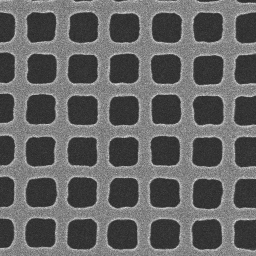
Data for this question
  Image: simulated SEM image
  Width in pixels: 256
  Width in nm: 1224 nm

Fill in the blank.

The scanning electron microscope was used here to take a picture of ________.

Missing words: a regular array of holes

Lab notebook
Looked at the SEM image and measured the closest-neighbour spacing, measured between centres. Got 40.8 pixels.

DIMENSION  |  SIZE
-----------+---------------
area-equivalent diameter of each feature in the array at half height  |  154 nm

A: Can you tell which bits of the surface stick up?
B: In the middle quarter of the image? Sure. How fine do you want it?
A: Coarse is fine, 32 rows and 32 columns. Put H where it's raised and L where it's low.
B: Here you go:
HLLLLLLLLHHLLLLLLLLHHHLLLLLLLHHH
HLLLLLLLLHHLLLLLLLLHHHLLLLLLLHHH
HLLLLLLLLHHLLLLLLLLHHHLLLLLLLHHH
HLLLLLLLHHHLLLLLLLLHHHLLLLLLLHHH
HHLLLLLHHHHHLLLLLLHHHHHLLLLLHHHH
HHHHHHHHHHHHHHHHHHHHHHHHHHHHHHHH
HHHHHHHHHHHHHHHHHHHHHHHHHHHHHHHH
HHHHHHHHHHHHHHHHHHHHHHHHHHHHHHHH
HLLLLLLLHHHHLLLLLLHHHHLLLLLLLHHH
HLLLLLLLLHHLLLLLLLLHHHLLLLLLLHHH
HLLLLLLLLHHLLLLLLLLHHHLLLLLLLHHH
HLLLLLLLLHHLLLLLLLLHHHLLLLLLLHHH
HLLLLLLLLHHLLLLLLLLHHHLLLLLLLHHH
HLLLLLLLLHHLLLLLLLLHHHLLLLLLLHHH
HLLLLLLLHHHHLLLLLLHHHHLLLLLLHHHH
HHHHHHHHHHHHHHHHHHHHHHHHHHHHHHHH
HHHHHHHHHHHHHHHHHHHHHHHHHHHHHHHH
HHHHHHHHHHHHHHHHHHHHHHHHHHHHHHHH
HHLLLLLLHHHHHLLLLLHHHHLLLLLLHHHH
HLLLLLLLHHHLLLLLLLHHHHLLLLLLLHHH
HLLLLLLLHHHLLLLLLLLHHHLLLLLLLHHH
HLLLLLLLHHHLLLLLLLLHHHLLLLLLLHHH
HLLLLLLLHHHLLLLLLLLHHHLLLLLLLHHH
HLLLLLLLHHHLLLLLLLLHHHLLLLLLLHHH
HLLLLLLLHHHLLLLLLLHHHHLLLLLLLHHH
HHHHLLLHHHHHLLLLLHHHHHHLLLLHHHHH
HHHHHHHHHHHHHHHHHHHHHHHHHHHHHHHH
HHHHHHHHHHHHHHHHHHHHHHHHHHHHHHHH
HHLLLLHHHHHHHLLLLHHHHHHLLLHHHHHH
HLLLLLLLHHHHLLLLLLHHHHLLLLLLLHHH
HLLLLLLLHHHLLLLLLLLHHLLLLLLLLHHH
HLLLLLLLHHHLLLLLLLLHHLLLLLLLLHHH